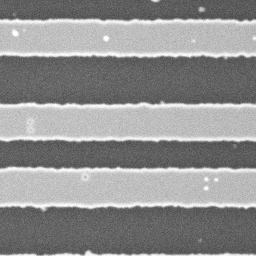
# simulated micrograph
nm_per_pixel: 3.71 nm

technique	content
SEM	lines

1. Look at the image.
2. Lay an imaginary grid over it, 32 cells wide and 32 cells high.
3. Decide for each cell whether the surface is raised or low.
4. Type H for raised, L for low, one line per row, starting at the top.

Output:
LLLLLLLLLLLLLLLLLLLLLLLLLLLLLLLL
LLLLLLLLLLLLLLLLLLLLLLLLLLLLLLLL
HHHLLLHHHHHHLLLLLLLLHHHHHHHHHLLL
HHHHHHHHHHHHHHHHHHHHHHHHHHHHHHHH
HHHHHHHHHHHHHHHHHHHHHHHHHHHHHHHH
HHHHHHHHHHHHHHHHHHHHHHHHHHHHHHHH
HHHHHHHHHHHHHHHHHHHHHHHHHHHHHHHH
LLLLLLLLLLLLLLLLLLLLLLLLLLLLLLLL
LLLLLLLLLLLLLLLLLLLLLLLLLLLLLLLL
LLLLLLLLLLLLLLLLLLLLLLLLLLLLLLLL
LLLLLLLLLLLLLLLLLLLLLLLLLLLLLLLL
LLLLLLLLLLLLLLLLLLLLLLLLLLLLLLLL
LLLLLLLLLLLLLLLLLLLLLLLLLLLLLLLL
HHHHHHHHHHHHHHHHHHHHHHHHHHHHHHHH
HHHHHHHHHHHHHHHHHHHHHHHHHHHHHHHH
HHHHHHHHHHHHHHHHHHHHHHHHHHHHHHHH
HHHHHHHHHHHHHHHHHHHHHHHHHHHHHHHH
HHLLHHLLHHHHHHHHLHHHHHHHHHHHHHHH
LLLLLLLLLLLLLLLLLLLLLLLLLLLLLLLL
LLLLLLLLLLLLLLLLLLLLLLLLLLLLLLLL
LLLLLLLLLLLLLLLLLLLLLLLLLLLLLLLL
HHHHHHHHHHHHHHHHHHHHHHHHHHHHHHHH
HHHHHHHHHHHHHHHHHHHHHHHHHHHHHHHH
HHHHHHHHHHHHHHHHHHHHHHHHHHHHHHHH
HHHHHHHHHHHHHHHHHHHHHHHHHHHHHHHH
HHHHHHHHHHHHHHHHHHHHHHHHHHHHHHHH
LLLLLLLLLLLLLLLLLLLLLLLLLLLLLLLL
LLLLLLLLLLLLLLLLLLLLLLLLLLLLLLLL
LLLLLLLLLLLLLLLLLLLLLLLLLLLLLLLL
LLLLLLLLLLLLLLLLLLLLLLLLLLLLLLLL
LLLLLLLLLLLLLLLLLLLLLLLLLLLLLLLL
LLLLLLLLLLLLLLLLLLLLLLLLLLLLLLLL